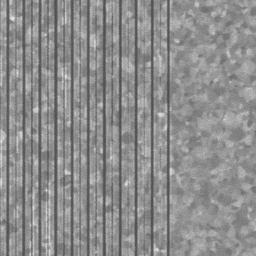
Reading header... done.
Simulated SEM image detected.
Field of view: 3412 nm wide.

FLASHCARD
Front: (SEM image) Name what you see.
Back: parallel lines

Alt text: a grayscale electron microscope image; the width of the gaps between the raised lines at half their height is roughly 45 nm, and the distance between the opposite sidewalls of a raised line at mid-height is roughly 0.0783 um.